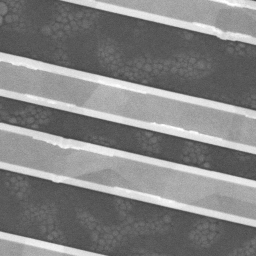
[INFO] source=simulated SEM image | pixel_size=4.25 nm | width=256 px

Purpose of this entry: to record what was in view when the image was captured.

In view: one or a few lines or trenches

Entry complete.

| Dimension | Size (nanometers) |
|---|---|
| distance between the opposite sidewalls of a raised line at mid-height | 154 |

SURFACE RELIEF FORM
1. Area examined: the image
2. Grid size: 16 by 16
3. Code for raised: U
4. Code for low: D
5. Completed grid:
DDDDDDDUUUUUUUUU
DDDDDDDDDDDUUUUU
DDDDDDDDDDDDDDDD
DDDDDDDDDDDDDDDD
UUUUDDDDDDDDDDDD
UUUUUUUUUDDDDDDD
DDDUUUUUUUUUUDDD
DDDDDDDDUUUUUUUU
UUUDDDDDDDDDUUUU
UUUUUUUDDDDDDDDD
DUUUUUUUUUUDDDDD
DDDDDUUUUUUUUUUU
DDDDDDDDDDUUUUUU
DDDDDDDDDDDDDDUU
DDDDDDDDDDDDDDDD
UUUUDDDDDDDDDDDD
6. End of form